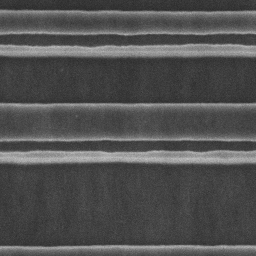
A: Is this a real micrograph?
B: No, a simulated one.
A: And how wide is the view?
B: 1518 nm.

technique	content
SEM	lines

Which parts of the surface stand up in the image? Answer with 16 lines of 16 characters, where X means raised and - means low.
----------------
XXXXXXXXXXXXXXXX
XXXXXXXXXXXXXXXX
----------------
----------------
----------------
------------X--X
XXXXXXXXXXXXXXXX
XXXXXXXXXXXXXXXX
XXXXXXXXXXXXXXXX
----------------
----------------
----------------
----------------
----------------
XXXXXXXXXXXXXXXX